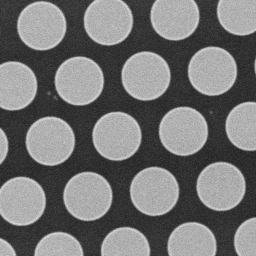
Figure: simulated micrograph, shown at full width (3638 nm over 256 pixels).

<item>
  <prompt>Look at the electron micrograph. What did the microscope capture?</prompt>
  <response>an array of small figures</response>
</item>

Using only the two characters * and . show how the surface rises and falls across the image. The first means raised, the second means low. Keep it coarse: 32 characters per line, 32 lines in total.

....**.....*****...*****...*****
...*****...*****...******..*****
..******...******..******..*****
..******...*****...*****....****
...*****...*****....****........
...****......*..................
..................*......***....
........***.....****....*****...
****...*****...******...******..
****...******..******...******..
*****..******..******...*****...
****...******...*****....***....
****....****....................
***...................**.....***
.............***.....****....***
....****....*****...******..****
...******...******..******..****
*..******...******..******...***
*..******...*****....****.....**
*...*****....***................
.....**...................***...
.................****....*****..
.***.....****....*****...******.
*****...******..******...******.
******..******..******...*****..
******..******...*****....****..
*****....****.....***...........
.****.....*....................*
...............*......****....**
......***....*****...******..***
*....*****...******..******..***
**..******...******..******...**